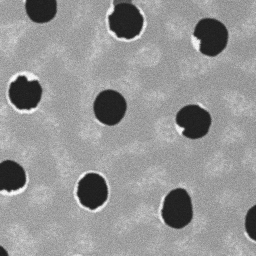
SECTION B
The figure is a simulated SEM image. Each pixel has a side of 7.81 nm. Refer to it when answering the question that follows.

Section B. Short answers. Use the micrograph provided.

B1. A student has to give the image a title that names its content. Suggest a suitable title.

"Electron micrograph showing holes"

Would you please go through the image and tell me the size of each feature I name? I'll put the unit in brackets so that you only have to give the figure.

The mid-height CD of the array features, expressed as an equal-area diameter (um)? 0.268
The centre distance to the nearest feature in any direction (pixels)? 85.9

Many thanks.